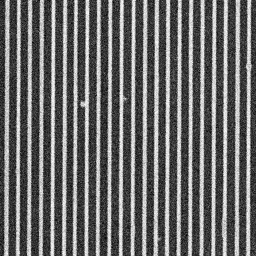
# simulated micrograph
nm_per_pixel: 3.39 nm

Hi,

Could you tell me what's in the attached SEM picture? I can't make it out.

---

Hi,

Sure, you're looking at parallel lines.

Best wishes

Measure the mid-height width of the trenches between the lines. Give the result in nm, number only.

27.2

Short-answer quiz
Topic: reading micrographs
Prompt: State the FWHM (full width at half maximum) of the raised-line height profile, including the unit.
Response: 0.0119 µm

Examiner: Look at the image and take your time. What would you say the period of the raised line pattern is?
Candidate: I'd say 39.1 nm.